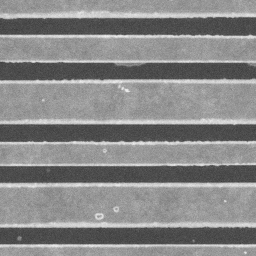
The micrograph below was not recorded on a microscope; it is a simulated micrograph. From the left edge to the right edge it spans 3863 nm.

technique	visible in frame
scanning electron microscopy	lines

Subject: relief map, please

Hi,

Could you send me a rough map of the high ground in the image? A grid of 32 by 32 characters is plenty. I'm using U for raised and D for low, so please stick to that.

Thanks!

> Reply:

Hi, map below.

UUUUUUUUUUUUUUUUUUUUUUUUUUUUUUUU
UUUUUUUUUUUUUUUUUUUUUUUUUUUUUUUU
DDDDDDDDDDDDDDDDDDDDDDDDDDDDDDDD
DDDDDDDDDDDDDDDDDDDDDDDDDDDDDDDD
UUUUUUUUUUUUUUUUUUUUUUDUDUDDDDDD
UUUUUUUUUUUUUUUUUUUUUUUUUUUUUUUU
UUUUUUUUUUUUUUUUUUUUUUUUUUUUUUUU
UUUUUUUUUUUUUUUUUUUUUUUUUUUUUUUU
DDDDDDDDDDDDDDDDDDDDDDDDDDDDDDDD
DDDDDDDDDDDDDDDDDDDDDDDDDDDDDDDD
UUUUUUUUUUUUUUUUUUUUUUUUUUUUUUUU
UUUUUUUUUUUUUUUUUUUUUUUUUUUUUUUU
UUUUUUUUUUUUUUUUUUUUUUUUUUUUUUUU
UUUUUUUUUUUUUUUUUUUUUUUUUUUUUUUU
UUUUUUUUUUUUUUUUUUUUUUUUUUUUUUUU
DDDDDDDDDDDDDDDDDDDDDDDDDDDDDDDD
DDDDDDDDDDDDDDDDDDDDDDDDDDDDDDDD
DDDDDDDDDDDDDDDDDDDDDDDDDDDDDDDD
UUUUUUUUUUUUUUUUUUUUUUUUUUUUUUUU
UUUUUUUUUUUUUUUUUUUUUUUUUUUUUUUU
UUUUUUUUUUUUUUUUUUUUUUUUUUUUUUUU
DDDDDDDDDDDDDDDDDDDDDDDDDDDDDDDD
DDDDDDDDDDDDDDDDDDDDDDDDDDDDDDDD
UUUUUUUUUUUUUUUUUUUUUUUUUUUUUUUU
UUUUUUUUUUUUUUUUUUUUUUUUUUUUUUUU
UUUUUUUUUUUUUUUUUUUUUUUUUUUUUUUU
UUUUUUUUUUUUUUUUUUUUUUUUUUUUUUUU
UUUUUUUUUUUUUUUUUUUUUUUUUUUUUUUU
DDDDDDDDDDDDDDDDDDDDDDDDDDDDDDDD
DDDDDDDDDDDDDDDDDDDDDDDDDDDDDDDD
DDDDDDDDDDDDDDDDDDDDDDDDDDDDDDDD
UUUUUUUUUUUUUUUUUUUUUUUUUUUUUUUU